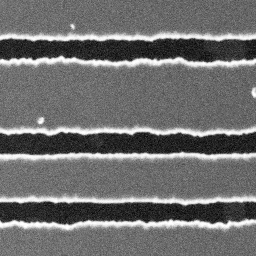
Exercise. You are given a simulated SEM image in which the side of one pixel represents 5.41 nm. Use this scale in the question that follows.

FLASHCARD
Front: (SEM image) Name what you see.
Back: lines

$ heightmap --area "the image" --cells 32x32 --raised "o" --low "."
oooooooooooooooooooooooooooooooo
oooooooooooooooooooooooooooooooo
oooooooooooooooooooooooooooooooo
oooooooooooooooooooooooooooooooo
oooooooooooooooooooooooooooooooo
................................
................................
.ooooooooo.......oo.ooo.........
oooooooooooooooooooooooooooooooo
oooooooooooooooooooooooooooooooo
oooooooooooooooooooooooooooooooo
oooooooooooooooooooooooooooooooo
oooooooooooooooooooooooooooooooo
oooooooooooooooooooooooooooooooo
oooooooooooooooooooooooooooooooo
oooooooooooooooooooooooooooooooo
ooooooo.ooooooooo..oooooooooooo.
................................
................................
oooooooooooooooooooooooooooooooo
oooooooooooooooooooooooooooooooo
oooooooooooooooooooooooooooooooo
oooooooooooooooooooooooooooooooo
oooooooooooooooooooooooooooooooo
oooooooooooooooooooooooooooooooo
.......................o........
................................
................................
oooooooooooooooooooooooooooooooo
oooooooooooooooooooooooooooooooo
oooooooooooooooooooooooooooooooo
oooooooooooooooooooooooooooooooo